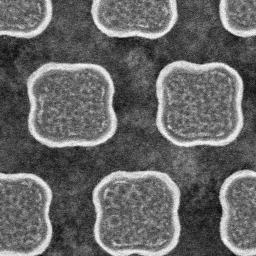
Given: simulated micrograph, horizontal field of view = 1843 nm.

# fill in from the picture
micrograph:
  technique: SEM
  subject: raised bodies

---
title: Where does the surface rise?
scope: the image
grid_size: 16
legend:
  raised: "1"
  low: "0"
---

1110001111100011
1110001111100011
0000000000000000
0000000000000000
0001110000111110
0011111000111110
0011111000111110
0011111000111110
0011111000011100
0000000000000000
0000000000000000
1110001111100011
1110001111100011
1110001111100011
1110001111100011
1100000111000001